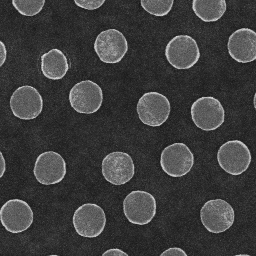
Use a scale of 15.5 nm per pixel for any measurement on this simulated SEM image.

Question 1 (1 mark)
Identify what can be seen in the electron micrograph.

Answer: a regular array of raised bodies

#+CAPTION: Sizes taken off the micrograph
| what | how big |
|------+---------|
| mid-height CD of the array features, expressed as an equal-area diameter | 508 nanometres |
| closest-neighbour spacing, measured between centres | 800 nanometres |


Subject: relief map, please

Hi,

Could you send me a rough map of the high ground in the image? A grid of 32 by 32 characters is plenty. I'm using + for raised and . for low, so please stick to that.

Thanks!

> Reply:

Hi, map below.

..+++.....+++.....++++..++++....
...++..............++...++++....
..........................+.....
................................
............+++..............+++
............++++.....++++....+++
+.....+.....++++.....++++....+++
+....+++.....++......++++.....++
.....+++..............+.........
......++........................
..........++....................
..+++....++++...................
.++++....++++.....+++....++.....
.++++....+++.....++++...++++....
..+++............++++...++++....
..................++....++++....
................................
................................
.....................++.....+++.
.....+++.....+++....++++...++++.
+...++++.....++++...++++...++++.
....++++.....++++....++.....++..
.....++......+++................
................................
................+++.............
.++............++++.......+++...
++++.....++++...+++......++++...
++++.....++++...+++......++++...
.++......++++.............++....
..........++....................
................................
.............++......++.........